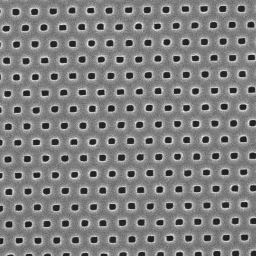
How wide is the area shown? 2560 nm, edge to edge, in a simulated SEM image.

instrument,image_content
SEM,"a regular array of holes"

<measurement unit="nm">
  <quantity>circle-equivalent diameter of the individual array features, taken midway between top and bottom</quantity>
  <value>74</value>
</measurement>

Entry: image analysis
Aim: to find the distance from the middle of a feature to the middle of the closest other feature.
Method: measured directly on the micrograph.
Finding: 185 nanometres